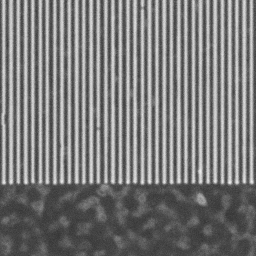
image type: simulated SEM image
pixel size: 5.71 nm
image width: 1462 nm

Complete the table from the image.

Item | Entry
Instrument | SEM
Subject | parallel lines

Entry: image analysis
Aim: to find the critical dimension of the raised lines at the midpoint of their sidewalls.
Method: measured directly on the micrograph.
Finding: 15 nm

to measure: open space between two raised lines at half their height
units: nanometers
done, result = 24.3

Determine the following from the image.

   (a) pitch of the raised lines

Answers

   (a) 41.6 nanometers